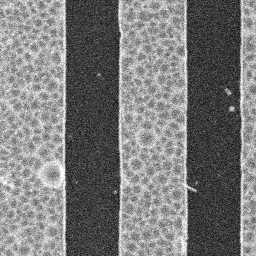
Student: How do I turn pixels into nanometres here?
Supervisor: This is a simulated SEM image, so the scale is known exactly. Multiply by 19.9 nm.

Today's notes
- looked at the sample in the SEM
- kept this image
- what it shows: one or a few lines or trenches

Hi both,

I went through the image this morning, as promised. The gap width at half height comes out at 1100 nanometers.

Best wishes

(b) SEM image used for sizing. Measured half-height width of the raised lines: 65.4 px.